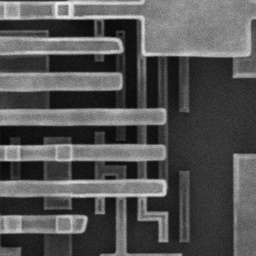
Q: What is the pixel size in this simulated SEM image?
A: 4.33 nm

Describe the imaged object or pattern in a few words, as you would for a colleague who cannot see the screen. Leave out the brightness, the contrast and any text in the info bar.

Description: wiring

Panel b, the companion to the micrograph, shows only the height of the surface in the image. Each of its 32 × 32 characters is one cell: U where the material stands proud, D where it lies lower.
UUUUUUUUUUUUUUUUUUUUUUUUUUUUUUUU
UUUUUUUUUUUUUUUUUUUUUUUUUUUUUUUU
DDDDDDDDDDDDDDDDDUUUUUUUUUUUUUUU
DDDDDDDDDDDDDDDDDDUUUUUUUUUUUUUD
DDDDDDDDDDDDDDDDDDUUUUUUUUUUUUUD
UUUUUUUUUUUUUUUDDDUUUUUUUUUUUUUD
UUUUUUUUUUUUUUUDDDUUUUUUUUUUUUUD
DDDDDDDDDDDDDDDDDDDDDDDDDDDDDDDD
DDDDDDDDDDDDDDDDDDDDDDDDDDDDDDDD
UUUUUUUUUUUUUUUDDDDDDDDDDDDDDDDD
UUUUUUUUUUUUUUUDDDDDDDDDDDDDDDDD
DDDDDDDDDDDDDDDDDDDDDDDDDDDDDDDD
DDDDDDDDDDDDDDDDDDDDDDDDDDDDDDDD
DDDDDDDDDDDDDDDDDDDDDDDDDDDDDDDD
UUUUUUUUUUUUUUUUUUUUUDDDDDDDDDDD
UUUUUUUUUUUUUUUUUUUUDDDDDDDDDDDD
DDDDDDDDDDDDDDDDDDDDDDDDDDDDDDDD
DDDDDDDDDDDDDDDDDDDDDDDDDDDDDDDD
UUUUUUUUUUUUUUUUUUUUUDDDDDDDDDDD
UUUUUUUUUUUUUUUUUUUUUDDDDDDDDDDD
DDDDDDDDDDDDDDDDDDDDDDDDDDDDDDDD
DDDDDDDDDDDDDDDDDDDDDDDDDDDDDDDD
DDDDDDDDDDDDDDDUUUUUDDDDDDDDDDDD
UUUUUUUUUUUUUUUUUUUUUDDDDDDDDDDD
UUUUUUUUUUUUUUUUUUUUDDDDDDDDDDDD
DDDDDDDDDDDDDDDDDDDDDDDDDDDDDDDD
DDDDDDDDDDDDDDDDDDDDDDDDDDDDDDDD
UUUUUUUUUUUDDDDDDDDDDDDDDDDDDDDD
UUUUUUUUUUUDDDDDDDDDDDDDDDDDDDDD
DDDDDDDDDDDDDDDDDDDDDDDDDDDDDDDD
DDDDDDDDDDDDDDDDDDDDDDDDDDDDDDDD
DDDDDDDDDDDDDDDDDDDDDDDDDDDDDDDD